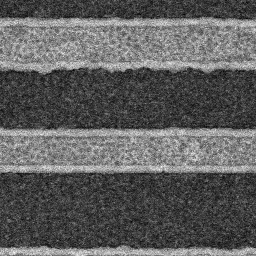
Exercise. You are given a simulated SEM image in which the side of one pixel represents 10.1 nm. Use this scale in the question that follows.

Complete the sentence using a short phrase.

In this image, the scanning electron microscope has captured one or a few lines or trenches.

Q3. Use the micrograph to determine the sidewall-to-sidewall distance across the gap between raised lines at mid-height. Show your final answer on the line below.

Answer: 76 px